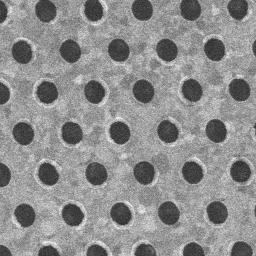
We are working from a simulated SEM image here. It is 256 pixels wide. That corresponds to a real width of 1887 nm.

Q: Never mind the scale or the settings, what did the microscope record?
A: a regular array of holes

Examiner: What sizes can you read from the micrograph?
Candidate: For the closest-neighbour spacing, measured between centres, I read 0.347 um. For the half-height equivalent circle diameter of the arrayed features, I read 168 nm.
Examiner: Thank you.